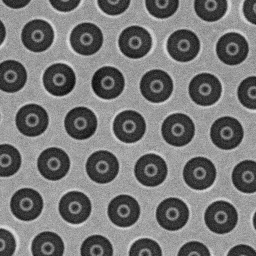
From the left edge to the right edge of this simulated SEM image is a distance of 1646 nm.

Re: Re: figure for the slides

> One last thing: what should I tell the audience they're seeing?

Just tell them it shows an array of small figures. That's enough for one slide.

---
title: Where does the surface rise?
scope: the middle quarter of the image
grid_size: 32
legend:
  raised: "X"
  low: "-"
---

--XXXXXXXX-XXXXXXXXXXXXXXXXXXXXX
--XXXXXX------XXXXXXX---XXXXXXXX
---XXXX--------XXXXX------XXXXXX
---XXXX---XX---XXXX--------XXXXX
---XXXX---XX---XXXX---XX---XXXXX
---XXXX---XX---XXXX---XXX--XXXX-
--XXXXX--------XXXX---XX---XXXX-
-XXXXXXX------XXXXX--------XXXX-
XXXXXXXXX----XXXXXXX------XXXXXX
XXXXXXXXXXXXXXXXXXXXXX---XXXXXXX
XXXX-XXXXXXXXXXXXXXXXXXXXXXXXXXX
XX-----XXXXXXXX--XXXXXXXXXXXXXXX
X-------XXXXX------XXXXXXX----XX
--------XXXXX-------XXXXX-------
---XX---XXXX---XX---XXXXX-------
---XX---XXXX---XXX---XXX---XX---
--------XXXX---XX----XXX---XXX--
X------XXXXX--------XXXX----X---
XX----XXXXXXX-------XXXXX-------
XXXXXXXXXXXXXX----XXXXXXX-------
XXXXXXXXXXXXXXXXXXXXXXXXXXX---XX
XXXXXXXXX-XXXXXXXXXXXXXXXXXXXXXX
-XXXXXX-----XXXXXXXX---XXXXXXXXX
-XXXXX-------XXXXXX------XXXXXXX
--XXXX---X----XXXX-------XXXXXX-
--XXX---XXX---XXXX---XX---XXXX--
-XXXX----XX---XXX---XXX---XXXX--
-XXXXX--------XXX----XX---XXXX--
XXXXXX-------XXXXX--------XXXX--
XXXXXXX-----XXXXXXX------XXXXX--
XXXXXXXXXXXXXXXXXXXX---XXXXXXXX-
XX-XXXXXXXXXXXXXXXXXXXXXXXXXXXXX